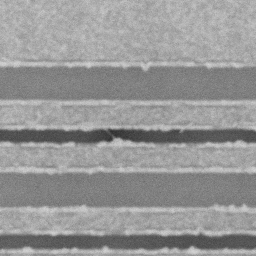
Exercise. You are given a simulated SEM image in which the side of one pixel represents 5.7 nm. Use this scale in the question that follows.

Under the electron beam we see parallel lines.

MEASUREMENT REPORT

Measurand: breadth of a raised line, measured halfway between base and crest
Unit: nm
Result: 162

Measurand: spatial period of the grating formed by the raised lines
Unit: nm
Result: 301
